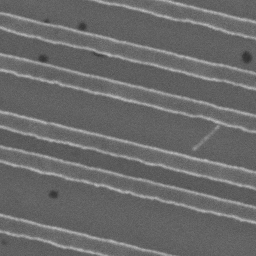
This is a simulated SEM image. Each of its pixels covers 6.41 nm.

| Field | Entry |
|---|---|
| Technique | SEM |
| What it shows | lines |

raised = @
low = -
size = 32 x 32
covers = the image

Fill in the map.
-------------@@@@@@@@@@---------
------------------@@@@@@@@@-----
@@@@------------------@@@@@@@@@-
@@@@@@@@------------------@@@@@@
---@@@@@@@@@------------------@@
-------@@@@@@@@@----------------
------------@@@@@@@@@-----------
@@@@------------@@@@@@@@@-------
@@@@@@@@------------@@@@@@@@@@--
---@@@@@@@@@------------@@@@@@@@
-------@@@@@@@@@-------------@@@
-----------@@@@@@@@@------------
---------------@@@@@@@@@--------
--------------------@@@@@@@@----
@@@---------------------@@@@@@@@
@@@@@@@---------------------@@@@
--@@@@@@@@@--------------------@
------@@@@@@@@@-----------------
@---------@@@@@@@@@-------------
@@@@@---------@@@@@@@@@---------
-@@@@@@@@---------@@@@@@@@@@----
-----@@@@@@@@@---------@@@@@@@@@
---------@@@@@@@@@---------@@@@@
--------------@@@@@@@@----------
-----------------@@@@@@@@@@-----
----------------------@@@@@@@@@-
--------------------------@@@@@@
@@@---------------------------@@
@@@@@@@-------------------------
--@@@@@@@@@---------------------
-------@@@@@@@@@----------------
-----------@@@@@@@@@------------